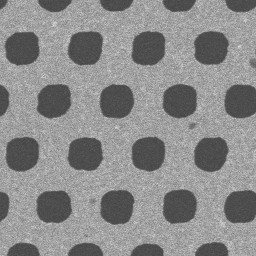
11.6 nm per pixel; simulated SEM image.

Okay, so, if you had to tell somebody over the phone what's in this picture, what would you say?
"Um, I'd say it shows a regular array of holes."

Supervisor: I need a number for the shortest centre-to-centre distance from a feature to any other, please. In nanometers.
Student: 712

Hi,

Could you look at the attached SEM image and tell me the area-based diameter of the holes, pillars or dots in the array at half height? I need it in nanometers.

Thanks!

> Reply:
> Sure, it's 408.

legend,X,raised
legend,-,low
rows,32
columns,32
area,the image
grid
-XXXX----XXXX----XXX----XXXX----
XXXXXXXXXXXXXXXXXXXXXXXXXXXXXXXX
XXXXXXXXXXXXXXXXXXXXXXXXXXXXXXXX
XXXXXXXXXXXXXXXXXXXXXXXXXXXXXXXX
X----XXXX----XXXX---XXXXX---XXXX
X----XXXX----XXXX----XXX-----XXX
X----XXX-----XXXX----XXX----XXXX
X---XXXXX---XXXXX---XXXXX---XXXX
XXXXXXXXXXXXXXXXXXXXXXXXXXXXXXXX
XXXXXXXXXXXXXXXXXXXXXXXXXXXXXXXX
XXXXXXXXXXXXXXXXXXXXXXXXXXXXXXXX
-XXXX----XXXX----XXXX----XXX----
-XXXX----XXXX----XXX-----XXX----
-XXXX----XXXX----XXX-----XXX----
XXXXX---XXXXX---XXXXX--XXXXXX--X
XXXXXXXXXXXXXXXXXXXXXXXXXXXXXXXX
XXXXXXXXXXXXXXXXXXXXXXXXXXXXXXXX
X---XXXXX---XXXXX---XXXXX---XXXX
X----XXXX----XXX-----XXX----XXXX
X----XXX-----XXX-----XXX----XXXX
X---XXXXX----XXXX---XXXX----XXXX
XX-XXXXXXXXXXXXXXXXXXXXXXXXXXXXX
XXXXXXXXXXXXXXXXXXXXXXXXXXXXXXXX
XXXXXXXXXXXXXXXXXXXXXXXXXXXXXXXX
-XXXX----XXXX----XXXX---XXXX----
-XXXX----XXXX----XXX-----XXX----
-XXXX----XXXX----XXX----XXXX----
XXXXX---XXXXX---XXXXX---XXXX----
XXXXXXXXXXXXXXXXXXXXXXXXXXXXXXXX
XXXXXXXXXXXXXXXXXXXXXXXXXXXXXXXX
XX--XXXXXX--XXXXXX-XXXXXXX--XXXX
X----XXXX----XXX----XXXX----XXXX